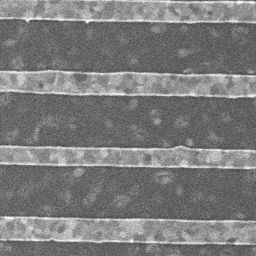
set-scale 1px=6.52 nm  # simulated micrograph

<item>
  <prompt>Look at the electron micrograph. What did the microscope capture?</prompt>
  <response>one or a few lines or trenches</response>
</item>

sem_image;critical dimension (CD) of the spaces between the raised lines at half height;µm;0.345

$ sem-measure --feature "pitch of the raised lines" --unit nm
479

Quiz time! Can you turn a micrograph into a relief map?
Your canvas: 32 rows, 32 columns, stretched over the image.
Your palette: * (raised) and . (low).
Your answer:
********************************
********************************
...*......**********************
................................
................................
................................
................................
................................
................................
*****************************..*
********************************
....****************************
................................
................................
................................
................................
................................
................................
********..............**........
********************************
...*****************************
................................
................................
................................
................................
................................
................................
*************...****............
********************************
********************************
...............................*
................................